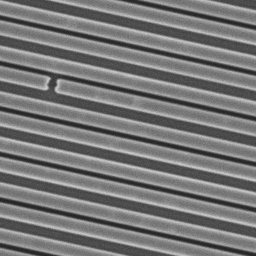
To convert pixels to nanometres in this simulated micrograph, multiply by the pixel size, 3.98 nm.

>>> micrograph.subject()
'parallel lines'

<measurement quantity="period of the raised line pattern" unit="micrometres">0.0884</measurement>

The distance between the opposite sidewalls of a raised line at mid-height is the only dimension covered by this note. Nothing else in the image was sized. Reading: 55.5 nanometers